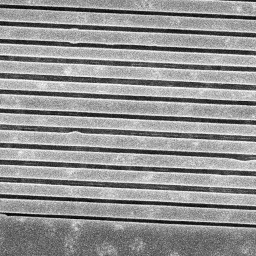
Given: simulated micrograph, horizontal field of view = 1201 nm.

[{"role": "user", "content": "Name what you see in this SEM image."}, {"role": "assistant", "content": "parallel lines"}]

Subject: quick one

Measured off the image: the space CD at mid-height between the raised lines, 22.8 nm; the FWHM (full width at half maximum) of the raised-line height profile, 12.6 px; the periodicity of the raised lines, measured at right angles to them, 81.2 nm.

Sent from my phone